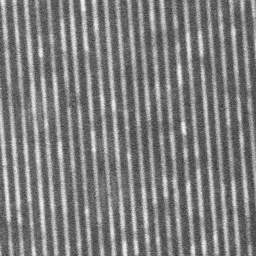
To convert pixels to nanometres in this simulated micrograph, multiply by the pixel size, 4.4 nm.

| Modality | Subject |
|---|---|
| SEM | parallel lines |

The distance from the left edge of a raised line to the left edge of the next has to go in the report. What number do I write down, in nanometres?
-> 49.9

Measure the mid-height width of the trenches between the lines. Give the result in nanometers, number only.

38.4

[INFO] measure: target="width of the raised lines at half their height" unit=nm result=13.2